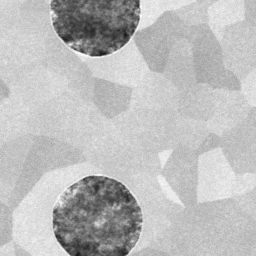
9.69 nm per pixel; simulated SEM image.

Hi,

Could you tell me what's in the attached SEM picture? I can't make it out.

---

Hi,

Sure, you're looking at holes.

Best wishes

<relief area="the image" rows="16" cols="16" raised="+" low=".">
+++......+++++++
+++......+++++++
++++....++++++++
++++++.+++++++++
++++++++++++++++
++++++++++++++++
++++++++++++++++
++++++++++++++++
++++++++++++++++
++++++++++++++++
++++++++++++++++
+++++...++++++++
++++.....+++++++
+++......+++++++
+++......+++++++
++++....++++++++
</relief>